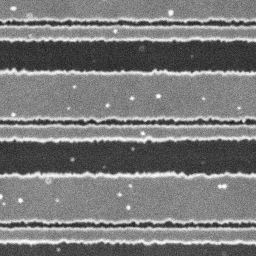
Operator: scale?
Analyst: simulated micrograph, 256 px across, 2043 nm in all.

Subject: lines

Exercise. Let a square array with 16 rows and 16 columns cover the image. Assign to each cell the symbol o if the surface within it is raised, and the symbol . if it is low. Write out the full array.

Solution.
oooooooooooooooo
oooooooooooooooo
.ooooooo.ooo...o
................
o..o............
oooooooooooooooo
oooooooooooooooo
oooooooooooooooo
oooooooooooooooo
................
................
oooooooooooooooo
oooooooooooooooo
oooooooooooooooo
oooooooooooooooo
................